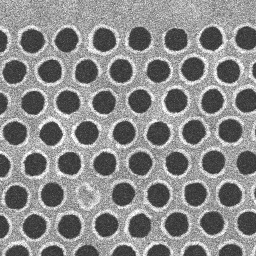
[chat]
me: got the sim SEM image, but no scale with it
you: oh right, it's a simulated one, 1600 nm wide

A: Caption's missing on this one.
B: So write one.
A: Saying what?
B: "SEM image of a regular array of holes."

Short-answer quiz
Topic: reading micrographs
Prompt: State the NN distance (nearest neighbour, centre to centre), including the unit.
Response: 216 nanometers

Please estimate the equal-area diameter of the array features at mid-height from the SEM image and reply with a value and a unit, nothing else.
144 nanometres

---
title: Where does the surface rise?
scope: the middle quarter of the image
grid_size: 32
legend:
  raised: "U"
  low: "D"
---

UUUDDDDDUUUUDDDDDUUUUDDDDDUUUUDD
UUUDDDDDUUUDDDDDDUUUUDDDDDUUUDDD
UUUDDDDDUUUDDDDDDUUUUDDDDDUUUUDD
UUUDDDDDUUUUDDDDDUUUUDDDDDUUUUDD
UUUUDDDUUUUUUUDUUUUUUUDDUUUUUUUU
UUUUUUUUUUUUUUUUUUUUUUUUUUUUUUUU
UUUUUUUUUUUUUUUUUUUDUUUUUUUDDUUU
DDDUUUUUDDDDUUUUUDDDDUUUUUDDDDUU
DDDDUUUDDDDDDUUUDDDDDDUUUDDDDDDU
DDDDUUUDDDDDDUUUDDDDDDUUUDDDDDDU
DDDDUUUDDDDDDUUUDDDDDUUUUUDDDDDU
DDDUUUUUDDDDUUUUUDDDDUUUUUDDDDUU
UUUUUUUUUDDUUUUUUUUUUUUUUUUUUUUU
UUUUUUUUUUUUUUUUUUUUUUUUUUUUUUUU
UUUUUDUUUUUUUUUDUUUUUUUDUUUUUUUD
UUUDDDDDUUUUUDDDDUUUUUDDDDUUUUDD
UUUDDDDDDUUUDDDDDDUUUDDDDDUUUUDD
UUUDDDDDDUUUDDDDDDUUUDDDDDDUUUDD
UUUDDDDDUUUUDDDDDDUUUDDDDDUUUUDD
UUUUDDDUUUUUUDDDDUUUUUDDDUUUUUUD
UUUUUUUUUUUUUUUUUUUUUUUUUUUUUUUU
UUUUUUUUUUUUUUUUUUUUUUUUUUUUUUUU
DDDUUUUUUDDDUUUUUUDDDUUUUUUDDDUU
DDDDUUUUDDDDDUUUDDDDDDUUUUDDDDDU
DDDDUUUDDDDDDUUUDDDDDDUUUDDDDDDU
DDDDUUUDDDDDDUUUDDDDDDUUUUDDDDDU
DDDDUUUUDDDDDUUUUDDDDUUUUUDDDDUU
UDDUUUUUUDDDUUUUUUDDUUUUUUUDDDUU
UUUUUUUUUUUUUUUUUUUUUUUUUUUUUUUU
UUUUUUUUUUUUUUUUUUUUUUUUUUUUUUUU
UUUUUUUUUUUUUDDDDUUUUUDDDUUUUUUD
UUUUUUUUUUUUDDDDDUUUUDDDDDUUUUDD